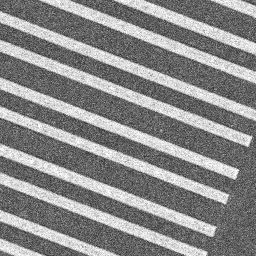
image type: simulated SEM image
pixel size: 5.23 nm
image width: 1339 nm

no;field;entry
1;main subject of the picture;parallel lines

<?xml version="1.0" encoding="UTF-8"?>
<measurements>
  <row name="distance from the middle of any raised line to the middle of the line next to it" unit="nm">161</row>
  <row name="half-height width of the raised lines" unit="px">9.08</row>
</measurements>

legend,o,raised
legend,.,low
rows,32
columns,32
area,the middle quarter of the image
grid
.............oooooo.............
ooo.............ooooo...........
ooooo.............oooooo........
..oooooo.............ooooo......
.....oooooo............oooooo...
........ooooo.............oooooo
..........oooooo.............ooo
.............ooooo.............o
...............oooooo...........
..................oooooo........
oo...................ooooo......
oooo...................oooooo...
.oooooo...................ooooo.
...ooooooo..................oooo
......oooooo..................oo
.........oooooo.................
...........oooooo...............
oo............oooooo............
oooo............ooooooo.........
ooooooo............oooooo.......
...oooooo.............oooooo....
......oooooo............oooooo..
........ooooooo............ooooo
...........oooooo............ooo
.............ooooooo............
................oooooo..........
o..................oooooo.......
ooo..................ooooooo....
oooooo..................oooooo..
..oooooo..................oooooo
.....oooooo..................ooo
.......ooooooo..................